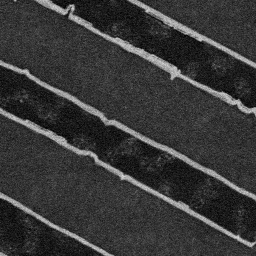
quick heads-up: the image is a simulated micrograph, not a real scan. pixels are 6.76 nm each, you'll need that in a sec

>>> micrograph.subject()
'one or a few lines or trenches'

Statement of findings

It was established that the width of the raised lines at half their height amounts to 0.296 microns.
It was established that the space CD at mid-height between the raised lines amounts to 0.492 µm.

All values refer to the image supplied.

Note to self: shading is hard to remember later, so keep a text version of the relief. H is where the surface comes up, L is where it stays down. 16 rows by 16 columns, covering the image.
LLLHHHHHHLLLLLLL
LLLLLHHHHHHLLLLL
LLLLLLLHHHHHHLLL
LLLLLLLLLHHHHHHL
HHLLLLLLLLLHHHHH
HHHLLLLLLLLLLHHH
HHHHHLLLLLLLLLLH
LHHHHHHLLLLLLLLL
LLLHHHHHHLLLLLLL
LLLLLHHHHHHLLLLL
LLLLLLLHHHHHHLLL
LLLLLLLLLHHHHHLL
HLLLLLLLLLLHHHHH
HHLLLLLLLLLLHHHH
HHHHLLLLLLLLLLHH
HHHHHHLLLLLLLLLL